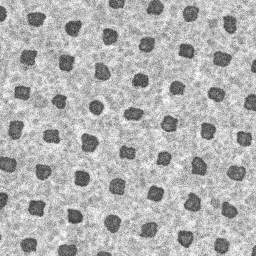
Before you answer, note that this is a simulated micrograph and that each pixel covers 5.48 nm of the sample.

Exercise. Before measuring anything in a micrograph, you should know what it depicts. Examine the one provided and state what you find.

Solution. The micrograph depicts a regular array of holes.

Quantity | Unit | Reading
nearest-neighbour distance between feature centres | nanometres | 198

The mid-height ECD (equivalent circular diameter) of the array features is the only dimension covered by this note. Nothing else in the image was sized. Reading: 95.9 nm